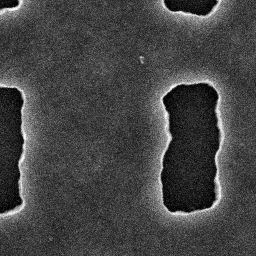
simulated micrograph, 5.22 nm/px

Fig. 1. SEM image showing holes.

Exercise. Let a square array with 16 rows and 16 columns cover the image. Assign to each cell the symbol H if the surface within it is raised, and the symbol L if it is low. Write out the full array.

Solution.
LHHHHHHHHHHLLHHH
HHHHHHHHHHHHHHHH
HHHHHHHHHHHHHHHH
HHHHHHHHHHHHHHHH
HHHHHHHHHHHHHHHH
LHHHHHHHHHHLLHHH
LHHHHHHHHHLLLLHH
LHHHHHHHHHHLLLHH
LHHHHHHHHHHLLLHH
LHHHHHHHHHLLLLHH
LHHHHHHHHHLLLLHH
LHHHHHHHHHLLLLHH
LHHHHHHHHHLLLLHH
HHHHHHHHHHHHHHHH
HHHHHHHHHHHHHHHH
HHHHHHHHHHHHHHHH